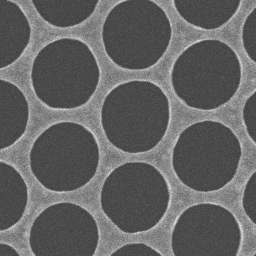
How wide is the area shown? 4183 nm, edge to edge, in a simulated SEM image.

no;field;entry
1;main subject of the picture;holes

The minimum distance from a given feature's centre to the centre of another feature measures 1330 nanometres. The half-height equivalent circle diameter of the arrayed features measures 1140 nm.